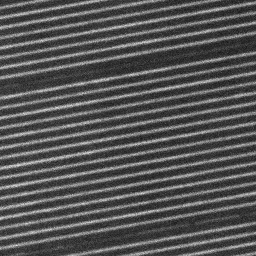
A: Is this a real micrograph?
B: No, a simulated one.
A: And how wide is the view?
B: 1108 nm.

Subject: parallel lines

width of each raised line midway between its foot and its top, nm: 8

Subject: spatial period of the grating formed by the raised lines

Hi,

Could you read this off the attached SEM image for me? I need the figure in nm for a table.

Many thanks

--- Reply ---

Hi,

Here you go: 42.7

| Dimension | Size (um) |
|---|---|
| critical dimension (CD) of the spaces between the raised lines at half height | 0.0351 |